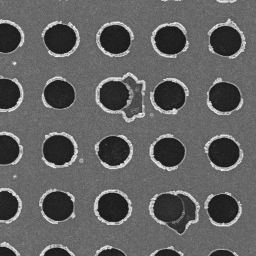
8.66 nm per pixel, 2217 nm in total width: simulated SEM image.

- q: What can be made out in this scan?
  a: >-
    a regular array of holes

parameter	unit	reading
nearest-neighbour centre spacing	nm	475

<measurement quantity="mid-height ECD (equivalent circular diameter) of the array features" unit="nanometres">266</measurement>